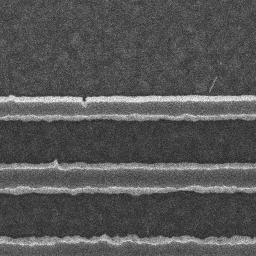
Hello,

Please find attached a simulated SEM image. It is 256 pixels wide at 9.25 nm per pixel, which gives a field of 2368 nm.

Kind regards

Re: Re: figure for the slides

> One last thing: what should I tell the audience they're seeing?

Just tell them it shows one or a few lines or trenches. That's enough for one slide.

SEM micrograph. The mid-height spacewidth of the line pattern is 454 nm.